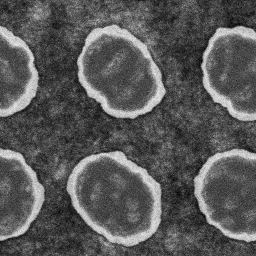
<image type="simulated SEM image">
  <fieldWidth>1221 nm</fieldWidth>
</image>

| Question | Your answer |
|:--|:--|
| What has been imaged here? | raised bodies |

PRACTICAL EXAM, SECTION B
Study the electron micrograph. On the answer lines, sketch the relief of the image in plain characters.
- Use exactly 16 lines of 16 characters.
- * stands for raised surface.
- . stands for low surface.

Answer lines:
................
................
*.....**.....***
**...****....***
**...*****...***
**...*****...***
*.....****....**
................
................
................
**...****....***
**...*****..****
***..*****...***
**...*****...***
*.....***.....**
................